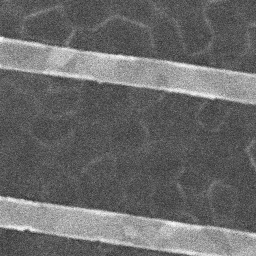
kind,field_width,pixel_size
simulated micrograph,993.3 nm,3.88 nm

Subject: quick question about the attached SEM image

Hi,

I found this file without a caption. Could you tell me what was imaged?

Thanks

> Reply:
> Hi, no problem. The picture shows one or a few lines or trenches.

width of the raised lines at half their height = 111 nm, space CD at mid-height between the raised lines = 0.5 microns